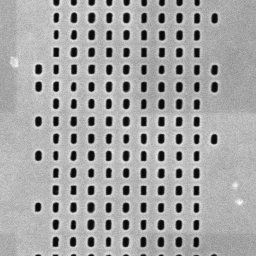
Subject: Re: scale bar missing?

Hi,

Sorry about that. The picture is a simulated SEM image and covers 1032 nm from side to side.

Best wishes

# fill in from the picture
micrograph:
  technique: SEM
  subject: a regular array of holes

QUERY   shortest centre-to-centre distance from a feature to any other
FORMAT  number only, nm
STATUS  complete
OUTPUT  69